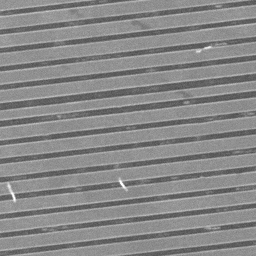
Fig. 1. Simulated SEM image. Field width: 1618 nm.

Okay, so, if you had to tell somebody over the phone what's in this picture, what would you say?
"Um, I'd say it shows parallel lines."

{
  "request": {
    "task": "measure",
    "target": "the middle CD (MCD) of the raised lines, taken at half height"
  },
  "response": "80.1 nanometres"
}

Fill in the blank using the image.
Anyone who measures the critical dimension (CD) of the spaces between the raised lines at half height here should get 36.1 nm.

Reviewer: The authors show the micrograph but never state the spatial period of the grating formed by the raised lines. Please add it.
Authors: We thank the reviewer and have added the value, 116 nm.